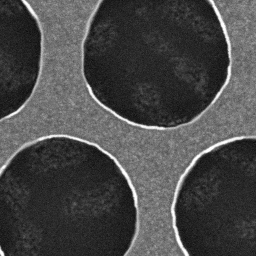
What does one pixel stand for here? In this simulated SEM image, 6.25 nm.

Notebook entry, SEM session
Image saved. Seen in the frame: holes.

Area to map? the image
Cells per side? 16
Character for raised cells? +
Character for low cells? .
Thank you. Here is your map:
..++++.......+++
..++++........++
...++.........++
...++.........++
..+++.........++
..++++........++
.+++++.......+++
++++++++....++++
++++++++++++++++
+.....+++++++...
.......+++++....
........+++.....
........+++.....
.........++.....
........+++.....
........++++....